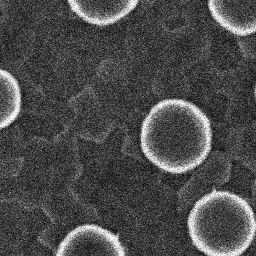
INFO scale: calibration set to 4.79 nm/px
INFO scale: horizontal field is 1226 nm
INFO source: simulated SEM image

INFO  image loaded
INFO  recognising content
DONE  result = raised bodies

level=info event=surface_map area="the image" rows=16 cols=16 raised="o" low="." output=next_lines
.....ooo.....ooo
..............oo
................
................
................
o...............
o.........oo....
o........oooo...
.........oooo...
.........oooo...
..........oo....
................
.............oo.
............oooo
.....oo.....oooo
....oooo.....oo.